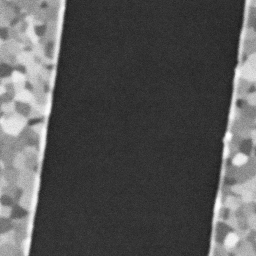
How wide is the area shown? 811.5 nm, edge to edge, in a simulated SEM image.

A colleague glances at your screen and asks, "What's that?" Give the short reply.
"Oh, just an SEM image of one or a few lines or trenches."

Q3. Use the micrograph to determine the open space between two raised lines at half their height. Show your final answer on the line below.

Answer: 0.576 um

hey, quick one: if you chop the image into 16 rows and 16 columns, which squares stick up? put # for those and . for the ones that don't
####...........#
####...........#
####...........#
####...........#
###............#
###............#
###............#
###...........##
###...........##
###...........##
##............##
##............##
##............##
##...........###
##...........###
##...........###